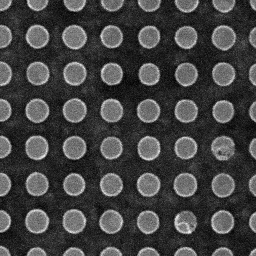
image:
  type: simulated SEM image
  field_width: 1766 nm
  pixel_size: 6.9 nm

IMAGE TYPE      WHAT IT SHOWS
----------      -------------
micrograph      a regular array of raised bodies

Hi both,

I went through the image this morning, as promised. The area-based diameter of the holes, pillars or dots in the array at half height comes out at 0.155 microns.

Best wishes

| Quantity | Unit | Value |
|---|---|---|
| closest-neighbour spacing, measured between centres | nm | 253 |